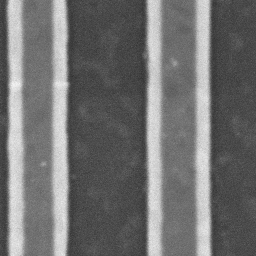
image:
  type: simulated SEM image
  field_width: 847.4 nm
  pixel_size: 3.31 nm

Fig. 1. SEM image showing one or a few lines or trenches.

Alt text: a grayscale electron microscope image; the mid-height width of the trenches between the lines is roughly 0.306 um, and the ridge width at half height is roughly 163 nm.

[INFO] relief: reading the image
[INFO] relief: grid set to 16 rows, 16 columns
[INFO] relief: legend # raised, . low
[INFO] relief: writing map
.###......###...
.###......###...
.###......###...
.###......###...
.###......###...
.###......###...
.###......###...
.###......###...
.###......###...
.###......###...
.###......###...
.###......###...
.###......###...
.###......###...
.###......###...
.###......###...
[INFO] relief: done